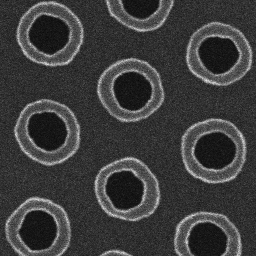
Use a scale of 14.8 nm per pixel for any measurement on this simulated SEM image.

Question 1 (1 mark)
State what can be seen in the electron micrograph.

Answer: ring-shaped raised bodies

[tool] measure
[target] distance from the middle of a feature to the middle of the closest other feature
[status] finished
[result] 1370 nm